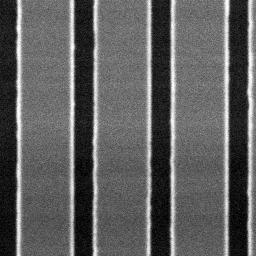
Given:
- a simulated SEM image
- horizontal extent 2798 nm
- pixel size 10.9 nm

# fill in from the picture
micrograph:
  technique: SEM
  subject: lines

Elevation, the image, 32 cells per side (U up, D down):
DDUUUUUUUDDDUUUUUUUDDUUUUUUUDDDU
DDUUUUUUUDDDUUUUUUUDDUUUUUUUDDDU
DDUUUUUUUDDDUUUUUUUDDUUUUUUUDDDU
DDUUUUUUUDDDUUUUUUUDDUUUUUUUDDDU
DDUUUUUUUDDDUUUUUUUDDUUUUUUUDDDU
DDUUUUUUUDDDUUUUUUUDDUUUUUUUDDDU
DDUUUUUUUDDDUUUUUUUDDUUUUUUUDDDU
DDUUUUUUUDDDUUUUUUUDDUUUUUUUDDDU
DDUUUUUUUDDDUUUUUUUDDUUUUUUUDDDU
DDUUUUUUUDDDUUUUUUUDDUUUUUUUDDDU
DDUUUUUUUDDDUUUUUUUDDUUUUUUUDDDU
DDUUUUUUUDDDUUUUUUUDDDUUUUUUDDDU
DDUUUUUUUDDDUUUUUUUDDDUUUUUUDDDU
DDUUUUUUUDDDUUUUUUUDDUUUUUUUDDDU
DDUUUUUUUDDDUUUUUUUDDUUUUUUUDDDU
DDUUUUUUUDDDUUUUUUUDDUUUUUUUDDDU
DDUUUUUUUDDDUUUUUUUDDUUUUUUUDDDU
DDUUUUUUUDDDUUUUUUUDDUUUUUUUDDDU
DDUUUUUUUDDDUUUUUUUDDUUUUUUUDDDU
DDUUUUUUUDDDUUUUUUUDDUUUUUUUDDDU
DDUUUUUUUDDDUUUUUUUDDUUUUUUUDDDU
DDUUUUUUUDDDUUUUUUUDDUUUUUUUDDDU
DDUUUUUUUDDDUUUUUUUDDUUUUUUUDDDU
DDUUUUUUUDDDUUUUUUUDDUUUUUUUDDDU
DDUUUUUUUDDDUUUUUUUDDUUUUUUUDDDU
DDUUUUUUUDDDUUUUUUUDDUUUUUUUDDDU
DDUUUUUUUDDDUUUUUUUDDUUUUUUUDDDU
DDUUUUUUUDDDUUUUUUUDDUUUUUUUDDDU
DDUUUUUUUDDDUUUUUUUDDUUUUUUUDDDU
DDUUUUUUUDDDUUUUUUUDDUUUUUUUDDDU
DDUUUUUUUDDDUUUUUUUDDUUUUUUUDDDU
DDUUUUUUUDDDUUUUUUUDDUUUUUUUDDDU